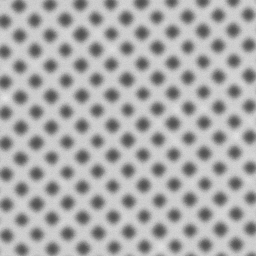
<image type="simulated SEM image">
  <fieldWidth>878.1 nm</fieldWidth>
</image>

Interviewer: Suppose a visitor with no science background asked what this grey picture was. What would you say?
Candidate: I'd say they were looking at a regular array of holes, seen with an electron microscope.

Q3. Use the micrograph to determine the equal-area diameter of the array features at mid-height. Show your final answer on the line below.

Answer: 13.5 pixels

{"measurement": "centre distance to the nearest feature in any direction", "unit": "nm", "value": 72.3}